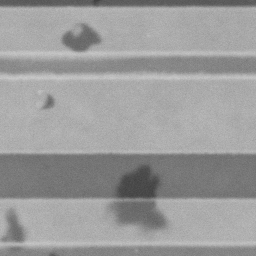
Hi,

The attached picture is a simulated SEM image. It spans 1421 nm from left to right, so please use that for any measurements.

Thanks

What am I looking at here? lines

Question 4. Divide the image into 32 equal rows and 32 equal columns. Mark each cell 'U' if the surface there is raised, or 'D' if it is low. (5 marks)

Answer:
DDDDDDDDDDDDDDDDDDDDDDDDDDDDDDDD
UUUUUUUUUUUUUUUUUUUUUUUUUUUUUUUU
UUUUUUUUUUUUUUUUUUUUUUUUUUUUUUUU
UUUUUUUUUUUUUUUUUUUUUUUUUUUUUUUU
UUUUUUUUUUUUUUUUUUUUUUUUUUUUUUUU
UUUUUUUUUUUUUUUUUUUUUUUUUUUUUUUU
UUUUUUUUUUUUUUUUUUUUUUUUUUUUUUUU
UUUUUUUUUUUUUUUUUUUUUUUUUUUUUUUU
UUUUUUUUUUUUUUUUUUUUUUUUUUUUUUUU
UUUUUUUUUUUUUUUUUUUUUUUUUUUUUUUU
UUUUUUUUUUUUUUUUUUUUUUUUUUUUUUUU
UUUUUUUUUUUUUUUUUUUUUUUUUUUUUUUU
UUUUUUUUUUUUUUUUUUUUUUUUUUUUUUUU
UUUUUUUUUUUUUUUUUUUUUUUUUUUUUUUU
UUUUUUUUUUUUUUUUUUUUUUUUUUUUUUUU
UUUUUUUUUUUUUUUUUUUUUUUUUUUUUUUU
UUUUUUUUUUUUUUUUUUUUUUUUUUUUUUUU
UUUUUUUUUUUUUUUUUUUUUUUUUUUUUUUU
UUUUUUUUUUUUUUUUUUUUUUUUUUUUUUUU
DDDDDDDDDDDDDDDDDDDDDDDDDDDDDDDD
DDDDDDDDDDDDDDDDDDDDDDDDDDDDDDDD
DDDDDDDDDDDDDDDDDDDDDDDDDDDDDDDD
DDDDDDDDDDDDDDDDDDDDDDDDDDDDDDDD
DDDDDDDDDDDDDDDDDDDDDDDDDDDDDDDD
DDDDDDDDDDDDDDDDDDDDDDDDDDDDDDDD
UUUUUUUUUUUUUUUUUUUUUUUUUUUUUUUU
UUUUUUUUUUUUUUUUUUUUUUUUUUUUUUUU
UUUUUUUUUUUUUUUUUUUUUUUUUUUUUUUU
UUUUUUUUUUUUUUUUUUUUUUUUUUUUUUUU
UUUUUUUUUUUUUUUUUUUUUUUUUUUUUUUU
UUUUUUUUUUUUUUUUUUUUUUUUUUUUUUUU
UUUUUUUUUUUUUUUUUUUUUUUUUUUUUUUU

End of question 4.